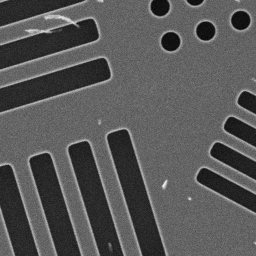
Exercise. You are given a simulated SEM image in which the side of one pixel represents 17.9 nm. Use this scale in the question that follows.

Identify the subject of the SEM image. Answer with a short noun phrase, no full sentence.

groups of lines, slits or small figures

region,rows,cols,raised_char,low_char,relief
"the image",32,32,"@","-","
----------@@@@@@@@@--@@@-@@@@@@@
------@@@@@@@@@@@@@--@@@@@@@@@-@
---@@@@@@@@-@@@@@@@@@@@@@@@@@--@
@@@@@@@-----@@@@@@@@@@@@@--@@--@
@@@@--------@@@@@@@@--@@@--@@@@@
@----------@@@@@@@@@--@@@@@@@@@@
-------@@@@@@@@@@@@@@@@@@@@@@@@@
----@@@@@@@@-@@@@@@@@@@@@@@@@@@@
-@@@@@@@------@@@@@@@@@@@@@@@@@@
@@@@@---------@@@@@@@@@@@@@@@@@@
@@----------@@@@@@@@@@@@@@@@@@@@
---------@@@@@@@@@@@@@@@@@@@@@-@
-----@@@@@@@@@@@@@@@@@@@@@@@@@--
--@@@@@@@@@@@@@@@@@@@@@@@@@@@@@-
@@@@@@@@@@@@@@@@@@@@@@@@@@@@@@@@
@@@@@@@@@@@@@@@@@@@@@@@@@@@@---@
@@@@@@@@@@@@@@--@@@@@@@@@@@@----
@@@@@@@@@@@@@---@@@@@@@@@@@@@@--
@@@@@@@@@--@@@---@@@@@@@@@---@@@
@@@@--@@@---@@---@@@@@@@@@@----@
@@@@---@@---@@---@@@@@@@@@@@----
--@@---@@---@@@---@@@@@@@--@@@--
--@@---@@@---@@---@@@@@@@----@@@
--@@@---@@---@@---@@@@@@@@-----@
---@@---@@---@@----@@@@@@@@@----
---@@---@@@---@@---@@@@@@@@@@@--
---@@----@@---@@---@@@@@@@@@@@@@
----@@---@@---@@---@@@@@@@@@@@@@
@---@@---@@---@@@---@@@@@@@@@@@@
@---@@---@@@---@@---@@@@@@@@@@@@
@---@@@---@@---@@---@@@@@@@@@@@@
@@---@@---@@---@@@---@@@@@@@@@@@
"